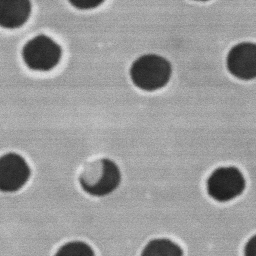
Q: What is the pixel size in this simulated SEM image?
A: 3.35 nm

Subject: holes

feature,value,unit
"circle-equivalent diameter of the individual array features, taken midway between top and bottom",123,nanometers